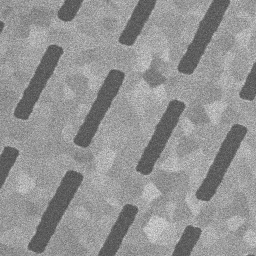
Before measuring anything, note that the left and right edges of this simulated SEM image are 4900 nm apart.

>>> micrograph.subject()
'holes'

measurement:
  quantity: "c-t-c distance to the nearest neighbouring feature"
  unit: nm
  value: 1270